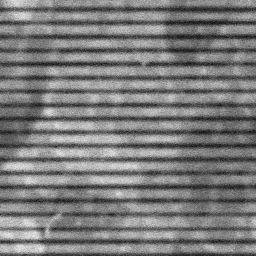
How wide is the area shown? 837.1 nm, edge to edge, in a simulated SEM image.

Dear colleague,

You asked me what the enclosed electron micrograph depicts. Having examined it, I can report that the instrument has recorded parallel lines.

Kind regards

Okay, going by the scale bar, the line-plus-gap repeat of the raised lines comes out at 0.0447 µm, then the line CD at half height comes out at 27.8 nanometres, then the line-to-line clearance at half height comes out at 15.5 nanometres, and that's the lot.